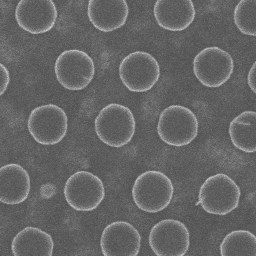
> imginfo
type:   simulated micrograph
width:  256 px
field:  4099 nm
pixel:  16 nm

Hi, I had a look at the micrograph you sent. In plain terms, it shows a regular array of raised bodies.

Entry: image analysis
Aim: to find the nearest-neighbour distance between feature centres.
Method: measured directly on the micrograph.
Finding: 1000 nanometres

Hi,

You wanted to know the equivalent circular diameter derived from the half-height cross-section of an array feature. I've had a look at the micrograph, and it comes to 627 nm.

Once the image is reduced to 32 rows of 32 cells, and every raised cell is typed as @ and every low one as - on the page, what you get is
--@@@@@----@@@@@----@@@@------@@
--@@@@@----@@@@@---@@@@@-----@@@
--@@@@@----@@@@@----@@@@-----@@@
---@@@------@@@------@@-------@@
--------------------------------
--------------------------------
--------@@---------------@@@----
-------@@@@-----@@@-----@@@@@---
@------@@@@@---@@@@@----@@@@@--@
@------@@@@@---@@@@@-----@@@@--@
@-------@@@-----@@@-------@@---@
--------------------------------
--------------------------------
-----@@------@@@-----@@---------
----@@@@----@@@@----@@@@------@@
----@@@@----@@@@@---@@@@@----@@@
----@@@@----@@@@@---@@@@@----@@@
-----@@------@@@----@@@@-----@@@
------------------------------@@
--------------------------------
--------------------------------
@@@-------@-------@-------------
@@@@-----@@@-----@@@@-----@@@---
@@@@----@@@@@----@@@@----@@@@@--
@@@-----@@@@@----@@@@----@@@@@--
---------@@@-----@@@@----@@@@@--
--------------------------@@@---
--------------------------------
---@---------@@@@--@@@@---------
--@@@@-------@@@@--@@@@@----@@@@
--@@@@@------@@@@--@@@@@----@@@@
--@@@@-------@@@@--@@@@-----@@@@